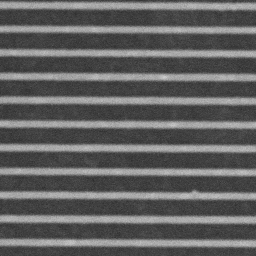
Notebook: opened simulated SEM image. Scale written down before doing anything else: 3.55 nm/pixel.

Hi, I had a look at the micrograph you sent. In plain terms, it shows parallel lines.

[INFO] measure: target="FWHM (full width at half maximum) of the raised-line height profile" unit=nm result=24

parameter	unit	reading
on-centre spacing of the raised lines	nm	84.3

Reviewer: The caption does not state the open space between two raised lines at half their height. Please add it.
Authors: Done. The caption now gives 17.5 px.